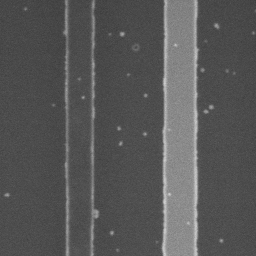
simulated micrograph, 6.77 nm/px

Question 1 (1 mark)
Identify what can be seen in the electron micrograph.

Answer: lines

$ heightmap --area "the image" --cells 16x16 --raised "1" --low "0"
0000110000000000
0000110000000000
0000110000000000
0000110000000000
0000110000000000
0000110000000000
0000110000000000
0000110000000000
0000110000000000
0000110000000000
0000110000000000
0000110000000000
0000110000000000
0000110000000000
0000110000000000
0000110000000000